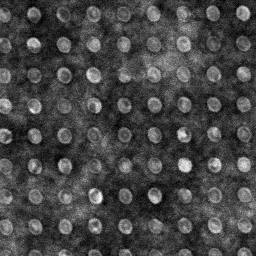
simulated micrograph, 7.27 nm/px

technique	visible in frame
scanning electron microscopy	a regular array of raised bodies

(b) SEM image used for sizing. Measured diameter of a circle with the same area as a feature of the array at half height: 99.4 nanometers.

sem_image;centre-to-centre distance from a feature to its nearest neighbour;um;0.215